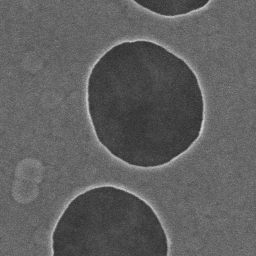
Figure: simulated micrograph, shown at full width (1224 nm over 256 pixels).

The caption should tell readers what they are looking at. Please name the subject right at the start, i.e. holes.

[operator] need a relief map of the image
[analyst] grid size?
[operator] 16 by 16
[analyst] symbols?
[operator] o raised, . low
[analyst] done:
ooooooooo...oooo
oooooooooooooooo
oooooooooooooooo
oooooo.....ooooo
oooooo......oooo
ooooo.......oooo
oooooo.......ooo
oooooo.......ooo
oooooo......oooo
ooooooo....ooooo
oooooooooooooooo
oooooooooooooooo
ooooo....ooooooo
oooo......oooooo
ooo.......oooooo
ooo.......oooooo